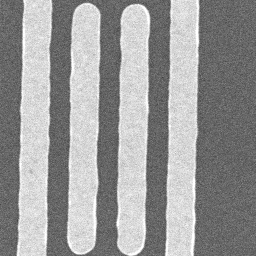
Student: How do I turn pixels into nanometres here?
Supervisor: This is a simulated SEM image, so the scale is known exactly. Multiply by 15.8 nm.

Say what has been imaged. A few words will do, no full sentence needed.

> groups of lines, slits or small figures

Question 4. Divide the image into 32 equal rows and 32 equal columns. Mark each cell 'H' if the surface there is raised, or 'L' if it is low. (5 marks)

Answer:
LLLHHHLLLLHLLLLLLLLLLHHHHLLLLLLL
LLLHHHLLLHHHLLLHHHLLLHHHHLLLLLLL
LLLHHHLLLHHHLLLHHHHLLHHHHLLLLLLL
LLLHHHLLLHHHLLLHHHHLLHHHHLLLLLLL
LLLHHHLLLHHHLLLHHHHLLHHHHLLLLLLL
LLLHHHLLLHHHLLLHHHLLLHHHHLLLLLLL
LLLHHHLLLHHHLLLHHHLLLHHHHLLLLLLL
LLLHHHLLLHHHLLLHHHLLLHHHHLLLLLLL
LLLHHHLLLHHHLLLHHHLLLHHHHLLLLLLL
LLLHHHLLLHHHLLLHHHLLLHHHHLLLLLLL
LLLHHHLLLHHHLLLHHHLLLHHHHLLLLLLL
LLLHHHLLLHHHLLLHHHLLLHHHHLLLLLLL
LLLHHHLLLHHHLLLHHHLLLHHHHLLLLLLL
LLLHHHLLLHHHLLLHHHLLLHHHHLLLLLLL
LLLHHHLLLHHHLLLHHHLLLHHHHLLLLLLL
LLLHHHLLLHHHLLLHHHLLLHHHHLLLLLLL
LLLHHHLLLHHHLLLHHHLLLHHHHLLLLLLL
LLLHHHLLLHHHLLLHHHLLLHHHLLLLLLLL
LLLHHHLLLHHHLLLHHHLLLHHHLLLLLLLL
LLLHHHLLLHHHLLLHHHLLLHHHLLLLLLLL
LLLHHHLLLHHHLLLHHHLLLHHHLLLLLLLL
LLLHHHLLLHHHLLLHHHLLLHHHLLLLLLLL
LLLHHHLLLHHHLLLHHHLLLHHHLLLLLLLL
LLLHHHLLLHHHLLLHHHLLLHHHLLLLLLLL
LLHHHHLLLHHHLLLHHHLLLHHHLLLLLLLL
LLHHHHLLLHHHLLLHHHLLLHHHLLLLLLLL
LLHHHHLLLHHHLLLHHHLLLHHHLLLLLLLL
LLHHHHLLLHHHLLLHHHLLLHHHLLLLLLLL
LLHHHHLLLHHHLLLHHHLLLHHHLLLLLLLL
LLHHHHLLLHHHLLLHHHLLLHHHLLLLLLLL
LLHHHHLLLHHHLLLHHHLLLHHHLLLLLLLL
LLHHHHLLLHHLLLLHHLLLLHHHLLLLLLLL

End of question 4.